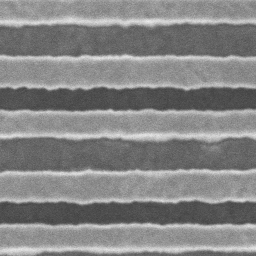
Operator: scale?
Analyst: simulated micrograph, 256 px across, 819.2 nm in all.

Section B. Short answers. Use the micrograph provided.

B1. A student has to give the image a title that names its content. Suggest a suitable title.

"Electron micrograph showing lines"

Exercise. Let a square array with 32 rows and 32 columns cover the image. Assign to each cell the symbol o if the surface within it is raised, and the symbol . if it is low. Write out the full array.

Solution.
oooooooooooooooooooooooooooooooo
oooooooooooooooooooooooooooooooo
oooooooooooooooooooooooooooooooo
................................
................................
................................
................................
oooooooooooooooooooooooooooooooo
oooooooooooooooooooooooooooooooo
oooooooooooooooooooooooooooooooo
oooooooooooooooooooooooooooooooo
................................
................................
................................
oooooooooooooooooooooooooooooooo
oooooooooooooooooooooooooooooooo
oooooooooooooooooooooooooooooooo
................................
................................
................................
................................
.o...oo...oooooooooooooooooooooo
oooooooooooooooooooooooooooooooo
oooooooooooooooooooooooooooooooo
oooooooooooooooooooooooooooooooo
................................
................................
................................
oooooooooooooooooooooooooooooooo
oooooooooooooooooooooooooooooooo
oooooooooooooooooooooooooooooooo
.o..............................